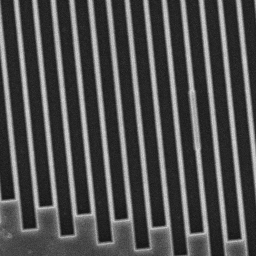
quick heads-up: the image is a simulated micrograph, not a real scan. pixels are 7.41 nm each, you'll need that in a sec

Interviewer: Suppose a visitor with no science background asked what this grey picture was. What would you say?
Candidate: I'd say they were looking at parallel lines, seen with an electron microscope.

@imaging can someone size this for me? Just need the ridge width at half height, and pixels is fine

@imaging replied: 3.6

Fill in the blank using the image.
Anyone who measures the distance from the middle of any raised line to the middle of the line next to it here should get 0.137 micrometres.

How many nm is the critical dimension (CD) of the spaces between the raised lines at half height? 110